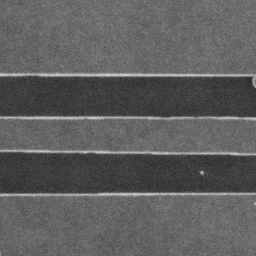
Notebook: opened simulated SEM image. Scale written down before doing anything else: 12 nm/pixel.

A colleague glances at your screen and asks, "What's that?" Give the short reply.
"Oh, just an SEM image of lines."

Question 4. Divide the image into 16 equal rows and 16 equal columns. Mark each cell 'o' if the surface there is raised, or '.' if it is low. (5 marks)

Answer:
oooooooooooooooo
oooooooooooooooo
oooooooooooooooo
oooooooooooooooo
oooooooooooooooo
................
................
oooooooooooooooo
oooooooooooooooo
.......ooooooooo
................
................
oooooooooooooooo
oooooooooooooooo
oooooooooooooooo
oooooooooooooooo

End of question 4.